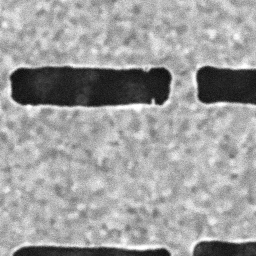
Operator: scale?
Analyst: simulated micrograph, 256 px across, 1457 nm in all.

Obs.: holes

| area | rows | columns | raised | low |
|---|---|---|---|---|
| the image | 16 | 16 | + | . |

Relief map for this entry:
++++++++++++++++
++++++++++++++++
++++++++++++++++
++++++++++++++++
+..........+....
+..........+....
+.........+++++.
++++++++++++++++
++++++++++++++++
++++++++++++++++
++++++++++++++++
++++++++++++++++
++++++++++++++++
++++++++++++++++
++++++++++++++++
+.......+.++....